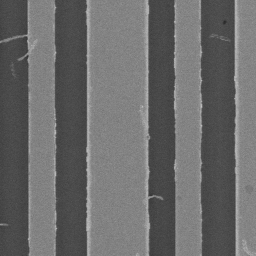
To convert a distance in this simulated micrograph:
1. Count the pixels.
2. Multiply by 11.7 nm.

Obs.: lines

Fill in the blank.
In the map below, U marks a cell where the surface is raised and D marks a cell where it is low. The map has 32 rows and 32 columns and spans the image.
DDDDUUUDDDDUUUUUUUDDDDUUUDDDDUUU
DDDDUUUDDDDUUUUUUUDDDDUUUDDDDUUU
DDDDUUUDDDDUUUUUUUDDDDUUUDDDDUUU
DDDDUUUDDDDUUUUUUUDDDDUUUDDDDUUU
DDDUUUUDDDDUUUUUUUDDDDUUUDDDDUUU
DDDDUUUDDDDUUUUUUUDDDDUUUDDDDUUU
DDDDUUUDDDDUUUUUUUDDDDUUUDDDDUUU
DDDDUUUDDDDUUUUUUUDDDDUUUDDDDUUU
DDDDUUUDDDDUUUUUUUDDDDUUUDDDDUUU
DDDDUUUDDDDUUUUUUUDDDDUUUDDDDUUU
DDDDUUUDDDDUUUUUUUDDDDUUUDDDDUUU
DDDDUUUDDDDUUUUUUUDDDDUUUDDDDDUU
DDDDUUUDDDDUUUUUUUDDDDUUUDDDDDUU
DDDDUUUDDDDUUUUUUUDDDDUUUDDDDDUU
DDDDUUUDDDDUUUUUUUDDDDUUUDDDDDUU
DDDDUUUDDDDUUUUUUUDDDDUUUDDDDDUU
DDDDUUUDDDDUUUUUUUUDDDUUUDDDDDUU
DDDDUUUDDDDUUUUUUUUDDDUUUDDDDDUU
DDDDUUUDDDDUUUUUUUDDDDUUUDDDDUUU
DDDDUUUDDDDUUUUUUUDDDDUUUDDDDDUU
DDDDUUUDDDDUUUUUUUDDDDUUUDDDDDUU
DDDDUUUDDDDUUUUUUUUDDDUUUDDDDDUU
DDDDUUUDDDDUUUUUUUDDDDUUUDDDDDUU
DDDDUUUDDDDUUUUUUUDDDDUUUDDDDDUU
DDDDUUUDDDDUUUUUUUUDDDUUUDDDDDUU
DDDDUUUDDDDUUUUUUUDDDDUUUDDDDDUU
DDDDUUUDDDDUUUUUUUUDDDUUUDDDDDUU
DDDDUUUDDDDUUUUUUUUDDDUUUDDDDDUU
DDDDUUUDDDDUUUUUUUUDDDUUUDDDDDUU
DDDDUUUDDDDUUUUUUUDDDDUUUDDDDDUU
DDDDUUUDDDDUUUUUUUDDDDUUUDDDDDUU
DDDDUUUDDDDUUUUUUUUDDDUUUDDDDDUU